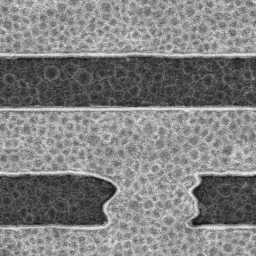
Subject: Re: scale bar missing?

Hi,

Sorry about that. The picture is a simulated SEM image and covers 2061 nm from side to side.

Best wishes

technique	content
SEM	one or a few lines or trenches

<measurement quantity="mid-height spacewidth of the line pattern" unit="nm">435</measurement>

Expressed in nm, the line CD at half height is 523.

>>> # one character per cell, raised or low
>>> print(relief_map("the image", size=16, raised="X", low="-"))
XXXXXXXXXXXXXXXX
XXXXXXXXXXXXXXXX
XXXXXXXXXXXXXXXX
----------------
----------------
----------------
----------------
XXXXXXXXXXXXXXXX
XXXXXXXXXXXXXXXX
XXXXXXXXXXXXXXXX
XXXXXXXXXXXXXXXX
-------XXXXX----
-------XXXXX----
-------XXXXX----
XXXXXXXXXXXXXXXX
XXXXXXXXXXXXXXXX